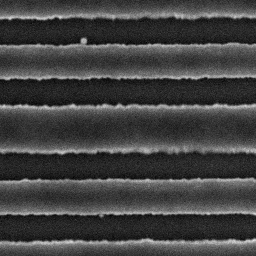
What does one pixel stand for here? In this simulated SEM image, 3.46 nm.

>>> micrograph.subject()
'lines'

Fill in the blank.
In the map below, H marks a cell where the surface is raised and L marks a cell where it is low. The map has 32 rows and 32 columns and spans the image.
HHHHHHHHHHHHHHHHHHHHHHHHHHHHHHHH
HHHHHHHHHHHHHHHHHHHHHHHHHHHHHHHH
LLLLLLLLLLLLLLLLLLLLLLLLLLLLLLLL
LLLLLLLLLLLLLLLLLLLLLLLLLLLLLLLL
LLLLLLLLLLLLLLLLLLLLLLLLLLLLLLLL
LLLLLLLLLLHLLLLLLLLLLLLLLLLLLHLL
HHHHHHHHHHHHHHHHHHHHHHHHHHHHHHHH
HHHHHHHHHHHHHHHHHHHHHHHHHHHHHHHH
HHHHHHHHHHHHHHHHHHHHHHHHHHHHHHHH
HHHHHHHHHHHHHHHHHHHHHHHHHHHHHHHH
LLLLLLLLLLLLLLLLLLLLLLLLLLLLLLLL
LLLLLLLLLLLLLLLLLLLLLLLLLLLLLLLL
LLLLLLLLLLLLLLLLLLLLLLLLLLLLLLLL
HHHHHHHHHHHHHHHHHHHHHHHHHHHHHHHH
HHHHHHHHHHHHHHHHHHHHHHHHHHHHHHHH
HHHHHHHHHHHHHHHHHHHHHHHHHHHHHHHH
HHHHHHHHHHHHHHHHHHHHHHHHHHHHHHHH
HHHHHHHHHHHHHHHHHHHHHHHHHHHHHHHH
HHHHHHHHHHHHHHHHHHHHHHHHHHHHHHHH
LLLLLLLLLLLLLLLLLLLLLLLLLLLLLLLL
LLLLLLLLLLLLLLLLLLLLLLLLLLLLLLLL
LLLLLLLLLLLLLLLLLLLLLLLLLLLLLLLL
LLLLLLLLLLLLLLHHHLHLLLLLHHHHHHHH
HHHHHHHHHHHHHHHHHHHHHHHHHHHHHHHH
HHHHHHHHHHHHHHHHHHHHHHHHHHHHHHHH
HHHHHHHHHHHHHHHHHHHHHHHHHHHHHHHH
HHHHHHHHHHHHHHHHHHHHHHHHHHHHHHHH
LLLLLLLLLLLLLLLLLLLLLLLLLLLLLLLL
LLLLLLLLLLLLLLLLLLLLLLLLLLLLLLLL
LLLLLLLLLLLLLLLLLLLLLLLLLLLLLLLL
HHHHHHHHHHHHHHHHHHHHHHHHHHHHHHHH
HHHHHHHHHHHHHHHHHHHHHHHHHHHHHHHH